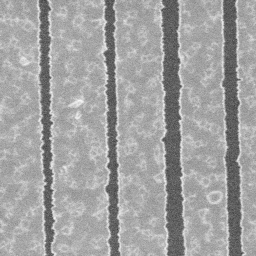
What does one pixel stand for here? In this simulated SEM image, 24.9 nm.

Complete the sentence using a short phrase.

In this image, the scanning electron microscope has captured one or a few lines or trenches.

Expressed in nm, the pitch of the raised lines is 1540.